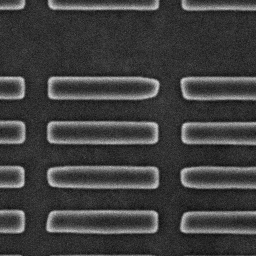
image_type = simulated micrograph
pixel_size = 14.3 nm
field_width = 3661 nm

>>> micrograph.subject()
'wiring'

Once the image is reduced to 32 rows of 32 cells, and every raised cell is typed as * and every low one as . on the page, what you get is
***...**************...*********
................................
................................
................................
................................
................................
................................
................................
................................
................................
***...**************...*********
***...**************...*********
................................
................................
................................
***...***********...............
***...**************...*********
***...*************....*********
................................
................................
................................
***...**************...*********
***...**************...*********
................................
................................
................................
................................
***...**************...*********
***...*************....*********
................................
................................
................................